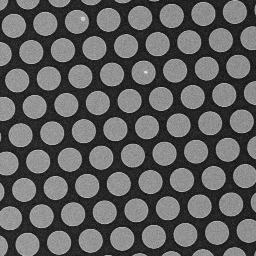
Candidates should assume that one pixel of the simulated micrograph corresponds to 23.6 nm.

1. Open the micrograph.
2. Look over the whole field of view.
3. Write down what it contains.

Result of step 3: an array of small figures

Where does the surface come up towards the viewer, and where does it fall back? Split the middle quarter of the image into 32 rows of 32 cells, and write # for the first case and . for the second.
...##.....####...#####...#####..
..#####..######..######..######.
.######..######..######..######.
.######..######..#####....####..
..#####...####....####.....#....
..####.........................#
...............##.....####....##
##.....###....#####...#####..###
###...#####...#####..######..###
###...#####...#####..######...##
###...#####...#####...#####...##
###...#####....###.....##.......
##.....##.......................
............#......####...#####.
...####....####...#####...#####.
..######..######..######..#####.
..######..######..######..#####.
..######..######..#####....####.
...####....####.....##..........
....##..........................
................###....####....#
###....####....#####..######..##
####...#####..######..######..##
####..######..######..######...#
####...#####...#####...####.....
####...####.....##..............
###.........................###.
............###.....####...#####
....####...#####...#####...#####
...######..######..#####...#####
#..######..#####...#####...#####
#..######..#####....####....###.